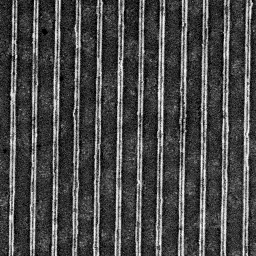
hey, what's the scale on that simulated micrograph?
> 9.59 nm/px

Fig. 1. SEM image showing parallel lines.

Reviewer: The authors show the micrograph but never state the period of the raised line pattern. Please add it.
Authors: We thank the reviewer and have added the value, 204 nm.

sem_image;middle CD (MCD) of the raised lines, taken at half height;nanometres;37.2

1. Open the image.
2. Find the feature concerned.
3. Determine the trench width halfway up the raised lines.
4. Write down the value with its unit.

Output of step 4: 17.2 pixels